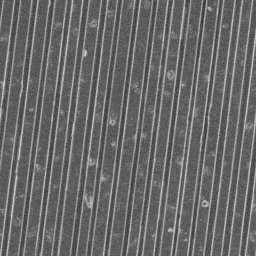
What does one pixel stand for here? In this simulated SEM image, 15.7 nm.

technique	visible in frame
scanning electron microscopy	parallel lines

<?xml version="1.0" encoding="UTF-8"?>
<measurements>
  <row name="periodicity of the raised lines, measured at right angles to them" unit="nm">265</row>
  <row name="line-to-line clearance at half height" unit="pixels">4.6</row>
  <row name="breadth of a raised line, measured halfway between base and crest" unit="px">12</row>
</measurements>